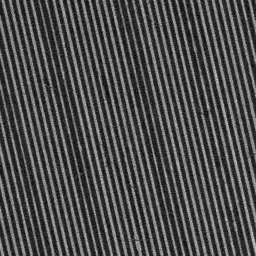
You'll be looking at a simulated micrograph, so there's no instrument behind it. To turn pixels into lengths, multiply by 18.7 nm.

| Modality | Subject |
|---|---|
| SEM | parallel lines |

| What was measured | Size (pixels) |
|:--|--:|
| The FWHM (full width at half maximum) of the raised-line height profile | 2.32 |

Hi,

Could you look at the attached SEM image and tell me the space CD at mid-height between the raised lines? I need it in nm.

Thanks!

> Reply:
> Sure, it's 88.8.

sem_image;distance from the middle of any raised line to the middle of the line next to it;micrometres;0.132